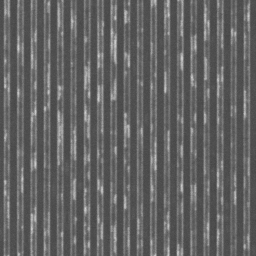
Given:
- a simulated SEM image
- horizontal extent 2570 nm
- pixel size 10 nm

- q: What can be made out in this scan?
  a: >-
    parallel lines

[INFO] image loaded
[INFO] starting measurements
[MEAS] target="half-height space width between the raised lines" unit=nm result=77.8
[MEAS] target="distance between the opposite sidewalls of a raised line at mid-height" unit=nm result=52.7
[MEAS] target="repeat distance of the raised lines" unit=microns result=0.134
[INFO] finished